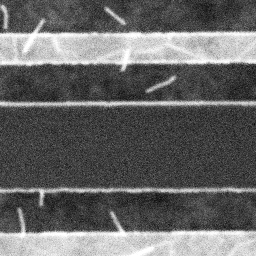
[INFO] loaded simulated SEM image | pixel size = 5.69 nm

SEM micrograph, lines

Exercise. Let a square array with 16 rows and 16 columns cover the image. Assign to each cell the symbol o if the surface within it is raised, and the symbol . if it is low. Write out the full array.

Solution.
................
................
oooooooooooooooo
oooooooooooooooo
................
................
oooooooooooooooo
oooooooooooooooo
oooooooooooooooo
oooooooooooooooo
oooooooooooooooo
oooooooooooooooo
................
................
................
oooooooooooooooo